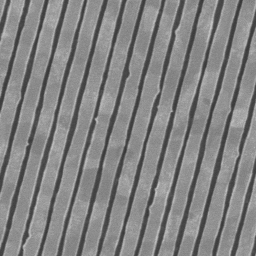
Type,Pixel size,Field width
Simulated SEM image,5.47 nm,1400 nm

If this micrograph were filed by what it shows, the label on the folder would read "parallel lines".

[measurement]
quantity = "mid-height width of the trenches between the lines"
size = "25.8 nm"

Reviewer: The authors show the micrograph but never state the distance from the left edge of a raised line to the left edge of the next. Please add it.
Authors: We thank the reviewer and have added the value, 0.103 micrometres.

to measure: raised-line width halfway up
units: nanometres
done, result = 72.3